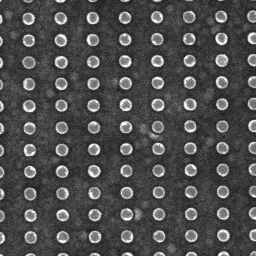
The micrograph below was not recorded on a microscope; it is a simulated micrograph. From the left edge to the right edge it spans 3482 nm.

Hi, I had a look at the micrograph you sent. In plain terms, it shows a regular array of raised bodies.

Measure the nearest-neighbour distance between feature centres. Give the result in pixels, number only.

21.7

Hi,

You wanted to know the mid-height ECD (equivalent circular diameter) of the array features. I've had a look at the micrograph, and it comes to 157 nanometers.